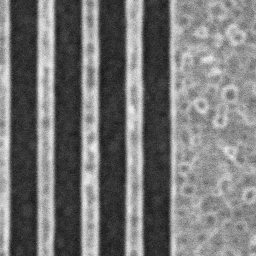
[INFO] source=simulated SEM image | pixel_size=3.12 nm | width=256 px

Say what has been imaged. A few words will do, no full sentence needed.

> parallel lines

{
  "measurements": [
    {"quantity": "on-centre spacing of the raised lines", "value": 138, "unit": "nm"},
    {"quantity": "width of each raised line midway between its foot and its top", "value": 0.0425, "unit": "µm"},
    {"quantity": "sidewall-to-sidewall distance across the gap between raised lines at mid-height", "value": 97.1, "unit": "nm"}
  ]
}